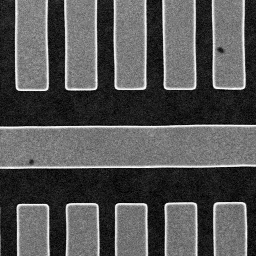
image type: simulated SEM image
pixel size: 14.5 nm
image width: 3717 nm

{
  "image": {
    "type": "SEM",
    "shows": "groups of lines, slits or small figures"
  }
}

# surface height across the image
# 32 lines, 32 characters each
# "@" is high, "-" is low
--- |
--@@@@--@@@@--@@@@--@@@@---@@@--
--@@@@--@@@@--@@@@--@@@@---@@@--
--@@@@--@@@@--@@@@--@@@@---@@@--
--@@@@--@@@@--@@@@--@@@@---@@@--
--@@@@--@@@@--@@@@--@@@@---@@@--
--@@@@--@@@@--@@@@--@@@@---@@@--
--@@@@--@@@@--@@@@---@@@---@@@--
--@@@@--@@@@--@@@@---@@@---@@@--
--@@@@--@@@@--@@@@---@@@---@@@@-
--@@@@--@@@@--@@@@---@@@---@@@@-
--@@@@--@@@@--@@@@---@@@---@@@@-
--------------------------------
--------------------------------
--------------------------------
--------------------------------
--------------------------------
@@@@@@@@@@@@@@@@@@@@@@@@@@@@@@@@
@@@@@@@@@@@@@@@@@@@@@@@@@@@@@@@@
@@@@@@@@@@@@@@@@@@@@@@@@@@@@@@@@
@@@@@@@@@@@@@@@@@@@@@@@@@@@@@@@@
@@@@@@@@@@@@@@@@@@@@@@@@@@@@@@@@
--------------------------------
--------------------------------
--------------------------------
--------------------------------
---------@@@---@-----@@@---@@@--
--@@@@--@@@@--@@@@---@@@@--@@@@-
--@@@@--@@@@--@@@@---@@@@--@@@@-
--@@@@--@@@@--@@@@---@@@@--@@@@-
--@@@@--@@@@--@@@@---@@@@--@@@@-
--@@@@--@@@@--@@@@---@@@@--@@@@-
--@@@@--@@@@--@@@@---@@@@--@@@@-